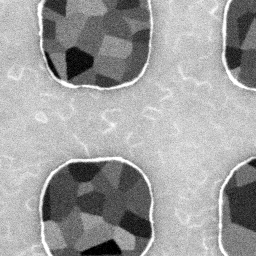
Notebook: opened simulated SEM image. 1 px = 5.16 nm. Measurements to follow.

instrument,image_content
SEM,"raised bodies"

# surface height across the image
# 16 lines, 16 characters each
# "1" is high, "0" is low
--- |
0011111110000011
0001111110000011
0001111110000011
0001111110000011
0001111110000011
0000001000000001
0000000000000000
0000000000000000
0000000000000000
0000000000000000
0000111110000001
0001111110000011
0001111111000011
0001111110000011
0001111111000011
0001111110000011